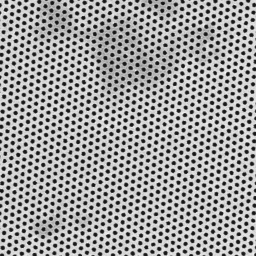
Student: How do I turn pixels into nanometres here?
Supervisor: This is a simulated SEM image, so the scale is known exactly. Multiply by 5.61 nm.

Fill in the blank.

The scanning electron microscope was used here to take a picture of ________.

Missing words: a regular array of holes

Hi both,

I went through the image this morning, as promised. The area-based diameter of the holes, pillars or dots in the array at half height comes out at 22.8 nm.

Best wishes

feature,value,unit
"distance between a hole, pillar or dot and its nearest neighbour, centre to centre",40.6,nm